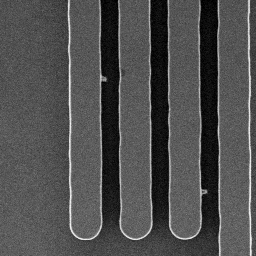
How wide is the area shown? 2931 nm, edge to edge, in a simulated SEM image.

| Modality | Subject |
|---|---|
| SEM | groups of lines, slits or small figures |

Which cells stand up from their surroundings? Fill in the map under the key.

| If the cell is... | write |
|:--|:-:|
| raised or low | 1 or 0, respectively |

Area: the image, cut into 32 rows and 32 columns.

00000000011110011110011110011110
00000000011110011110011110011110
00000000011110011110011110011110
00000000011110011110011110011110
00000000011110011110011110011110
00000000011110011110011110011110
00000000011110011110011110011110
00000000011110011110011110011110
00000000011110011110011110011110
00000000011110011110011110011110
00000000011110011110011110011110
00000000011110011110011110011110
00000000011110011110011110011110
00000000011110011110011110011110
00000000011110011110011110011110
00000000011110011110011110011110
00000000011110011110011110011110
00000000011110011110011110011110
00000000011110011110011110011110
00000000011110011110011110011110
00000000011110011110011110011110
00000000011110011110011110011110
00000000011110011110011110011110
00000000011110011110011110011110
00000000011110011110011110011110
00000000011110011110011110011110
00000000011110011110011110011110
00000000011110011110011110001110
00000000011110011110011110001110
00000000011100001100001100011110
00000000000000000000000000011110
00000000000000000000000000011110